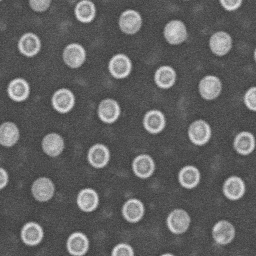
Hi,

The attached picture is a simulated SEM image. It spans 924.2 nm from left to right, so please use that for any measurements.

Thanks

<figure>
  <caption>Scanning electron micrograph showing a regular array of raised bodies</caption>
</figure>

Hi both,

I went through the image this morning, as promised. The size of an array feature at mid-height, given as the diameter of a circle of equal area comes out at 0.0784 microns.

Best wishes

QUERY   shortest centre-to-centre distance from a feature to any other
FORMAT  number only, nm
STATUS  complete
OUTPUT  165